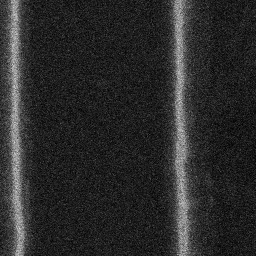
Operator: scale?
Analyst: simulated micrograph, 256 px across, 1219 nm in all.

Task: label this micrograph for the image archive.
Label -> one or a few lines or trenches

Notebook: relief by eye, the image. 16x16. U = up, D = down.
DUUUUUUUUUUDDDDD
DUUUUUUUUUUDDDDD
DUUUUUUUUUUDDDDD
DUUUUUUUUUUDDDDD
DUUUUUUUUUUDDDDD
DUUUUUUUUUUDDDDD
DUUUUUUUUUUDDDDD
DUUUUUUUUUUDDDDD
DUUUUUUUUUUDDDDD
DUUUUUUUUUUDDDDD
DUUUUUUUUUUDDDDD
DUUUUUUUUUUDDDDD
DUUUUUUUUUUDDDDD
DUUUUUUUUUUDDDDD
DUUUUUUUUUUUDDDD
DUUUUUUUUUUUDDDD